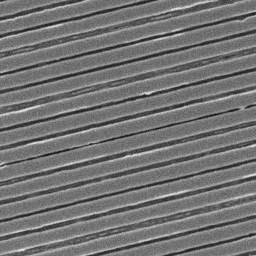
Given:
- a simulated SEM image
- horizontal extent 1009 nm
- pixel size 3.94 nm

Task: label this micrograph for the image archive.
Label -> parallel lines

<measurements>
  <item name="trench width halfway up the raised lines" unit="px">4.57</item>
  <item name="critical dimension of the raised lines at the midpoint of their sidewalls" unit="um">0.0546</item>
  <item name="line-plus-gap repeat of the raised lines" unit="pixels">18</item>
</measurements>